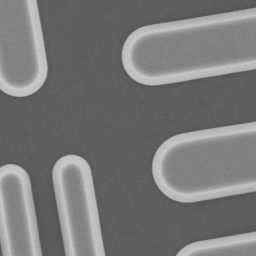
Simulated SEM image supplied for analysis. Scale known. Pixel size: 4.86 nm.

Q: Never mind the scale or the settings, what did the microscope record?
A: groups of lines, slits or small figures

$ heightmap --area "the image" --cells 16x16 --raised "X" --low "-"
XX--------------
XX---------XXXXX
XXX-----XXXXXXXX
XXX-----XXXXXXXX
XXX-----XXXXX---
XX--------------
----------------
----------------
------------XXXX
----------XXXXXX
----X-----XXXXXX
XX--XX----XXXXXX
XX--XX----------
XX--XX----------
XX--XX----------
XX--XX------XXXX